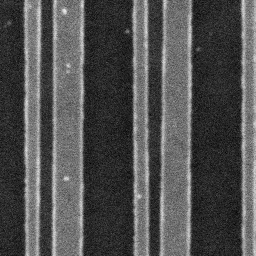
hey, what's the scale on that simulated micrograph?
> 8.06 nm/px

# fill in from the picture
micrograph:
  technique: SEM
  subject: lines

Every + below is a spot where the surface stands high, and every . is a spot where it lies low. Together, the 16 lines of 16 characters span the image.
..+++...++++...+
..+++...++++...+
..+++...++++...+
..+++...++++...+
..+++...++++...+
..+++...++++...+
..+++...++++...+
..+++...++++...+
..+++...++++...+
..+++...++++...+
..+++...++++...+
..+++...++++...+
..+++...++++...+
..+++...++++...+
..+++...++++...+
..+++...++++...+